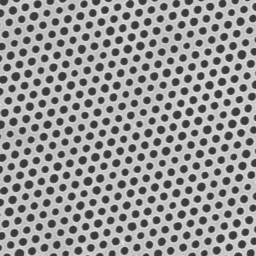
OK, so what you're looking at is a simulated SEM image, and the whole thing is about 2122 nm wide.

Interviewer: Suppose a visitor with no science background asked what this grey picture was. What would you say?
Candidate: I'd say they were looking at a regular array of holes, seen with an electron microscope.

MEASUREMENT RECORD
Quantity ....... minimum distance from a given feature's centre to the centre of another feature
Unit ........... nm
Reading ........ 103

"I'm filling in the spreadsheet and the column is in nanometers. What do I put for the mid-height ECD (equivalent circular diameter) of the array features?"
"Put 68.1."